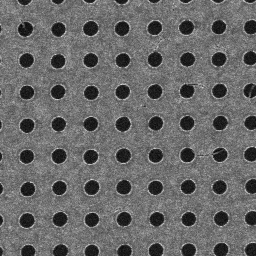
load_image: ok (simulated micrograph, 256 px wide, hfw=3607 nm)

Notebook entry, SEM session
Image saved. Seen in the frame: a regular array of holes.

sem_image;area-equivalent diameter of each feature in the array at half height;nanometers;217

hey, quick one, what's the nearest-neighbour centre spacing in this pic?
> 443 nm